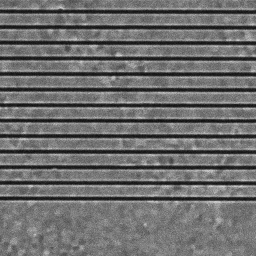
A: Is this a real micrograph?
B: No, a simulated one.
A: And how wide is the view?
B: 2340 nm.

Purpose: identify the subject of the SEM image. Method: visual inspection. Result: parallel lines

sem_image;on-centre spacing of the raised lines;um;0.142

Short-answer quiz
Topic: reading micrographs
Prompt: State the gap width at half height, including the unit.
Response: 41.1 nanometers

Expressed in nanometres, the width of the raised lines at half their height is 100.